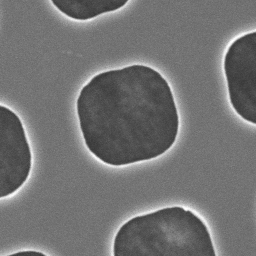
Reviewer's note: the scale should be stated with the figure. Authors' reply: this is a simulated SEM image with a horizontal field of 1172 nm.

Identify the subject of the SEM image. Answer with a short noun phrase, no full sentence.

holes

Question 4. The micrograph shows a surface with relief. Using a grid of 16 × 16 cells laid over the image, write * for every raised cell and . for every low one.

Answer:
****...*********
****************
***************.
**************..
*******...****..
*****......***..
*****......***..
.****......****.
..***......*****
..****....******
..**************
.***************
****************
*********...****
*******......***
*******......***